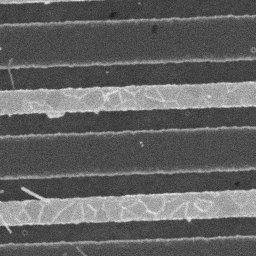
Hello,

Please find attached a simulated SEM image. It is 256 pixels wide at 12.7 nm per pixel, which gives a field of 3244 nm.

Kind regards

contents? lines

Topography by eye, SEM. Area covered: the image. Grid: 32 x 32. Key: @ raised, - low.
--------------------------------
--------------------------------
----------------@@@@@@@@@@@@@@@@
@@@@@@@@@@@@@@@@@@@@@@@@@@@@@@@@
@@@@@@@@@@@@@@@@@@@@@@@@@@@@@@@@
@@@@@@@@@@@@@@@@@@@@@@@@@@@@@@@@
@@@@@@@@@@@@@@@@@@@@@@@@@@@@@@@@
@@@@@@@@@@@@@@@@@@@@@@@@@@@@@@--
@@@-----------------------------
--------------------------------
--------------------------@@@@@@
@@@@@@@@@@@@@@@@@@@@@@@@@@@@@@@@
@@@@@@@@@@@@@@@@@@@@@@@@@@@@@@@@
@@@@@@@@@@@@@@@@@@@@@@@@--------
--------------------------------
--------------------------------
---------------@@@@@@@@@@@@@@@@@
@@@@@@@@@@@@@@@@@@@@@@@@@@@@@@@@
@@@@@@@@@@@@@@@@@@@@@@@@@@@@@@@@
@@@@@@@@@@@@@@@@@@@@@@@@@@@@@@@@
@@@@@@@@@@@@@@@@@@@@@@@@@@@@@@@@
@@@@@@@@@@@@@@@@@@@@@@----------
--------------------------------
--------------------------------
----------------@@@@@@@@@@@@@@@@
@@@@@@@@@@@@@@@@@@@@@@@@@@@@@@@@
@@@@@@@@@@@@@@@@@@@@@@@@@@@@@@@@
@@@@@@@@@@@@@@@@@---------------
--------------------------------
--------------------------------
-@--@@@@@@@@@@@@@@@@@@@@@@@@@@@@
@@@@@@@@@@@@@@@@@@@@@@@@@@@@@@@@